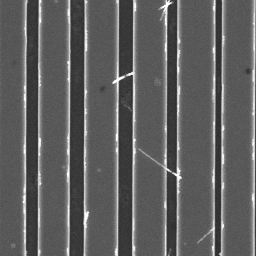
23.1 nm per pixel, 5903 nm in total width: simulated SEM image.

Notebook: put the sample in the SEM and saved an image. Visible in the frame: parallel lines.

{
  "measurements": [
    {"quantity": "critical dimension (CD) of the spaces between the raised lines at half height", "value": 13.3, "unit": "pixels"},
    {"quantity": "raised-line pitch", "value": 1060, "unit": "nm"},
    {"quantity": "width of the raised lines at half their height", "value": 776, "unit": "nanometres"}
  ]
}